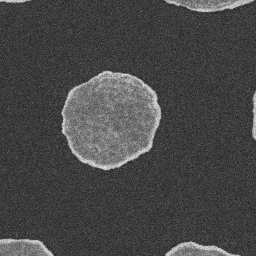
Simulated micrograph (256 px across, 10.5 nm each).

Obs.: raised bodies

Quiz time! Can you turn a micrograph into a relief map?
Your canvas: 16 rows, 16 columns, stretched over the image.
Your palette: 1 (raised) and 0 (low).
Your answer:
0000000000001100
0000000000000000
0000000000000000
0000000000000000
0000000000000000
0000011110000000
0000111111000000
0000111111000000
0000111111000000
0000011110000000
0000000000000000
0000000000000000
0000000000000000
0000000000000000
0000000000000000
1110000000011000